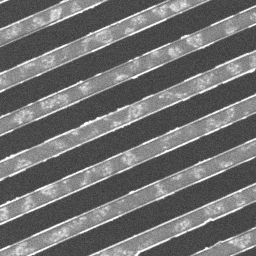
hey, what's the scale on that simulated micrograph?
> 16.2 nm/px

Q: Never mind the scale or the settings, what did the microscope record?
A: parallel lines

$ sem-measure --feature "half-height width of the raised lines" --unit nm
400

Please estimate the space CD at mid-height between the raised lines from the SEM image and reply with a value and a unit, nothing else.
252 nm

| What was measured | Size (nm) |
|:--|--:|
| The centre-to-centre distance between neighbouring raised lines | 657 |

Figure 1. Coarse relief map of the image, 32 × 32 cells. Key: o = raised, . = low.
oooooooo....oooooooo.....ooooooo
ooooo.....oooooooo....oooooooo..
ooo....ooooooooo....oooooooo....
o....oooooooo.....oooooooo.....o
...oooooooo.....oooooooo....oooo
.oooooooo.....ooooooo.....oooooo
oooooo.....oooooooo.....oooooooo
oooo.....oooooooo.....oooooooo..
oo.....ooooooo.....oooooooo.....
....oooooooo.....oooooooo.....oo
..oooooooo.....ooooooo.....ooooo
ooooooo.....oooooooo.....ooooooo
ooooo.....oooooooo.....oooooooo.
ooo.....ooooooo.....oooooooo....
o....oooooooo.....oooooooo.....o
...oooooooo.....oooooooo.....ooo
.oooooooo....oooooooo.....oooooo
oooooo.....oooooooo.....oooooooo
oooo.....oooooooo.....ooooooo...
oo.....oooooooo....oooooooo.....
....oooooooo.....oooooooo.....oo
..oooooooo.....oooooooo....ooooo
oooooooo.....ooooooo.....ooooooo
ooooo.....oooooooo.....oooooooo.
ooo.....oooooooo.....oooooooo...
o.....ooooooo.....oooooooo.....o
...oooooooo.....oooooooo.....ooo
.oooooooo.....oooooooo....oooooo
ooooooo....oooooooo.....oooooooo
oooo.....oooooooo.....oooooooo..
oo.....oooooooo....oooooooo.....
.....oooooooo....oooooooo.....oo